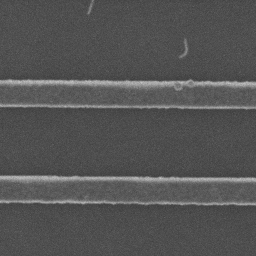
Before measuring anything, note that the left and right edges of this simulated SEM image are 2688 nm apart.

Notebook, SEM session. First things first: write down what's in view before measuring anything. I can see lines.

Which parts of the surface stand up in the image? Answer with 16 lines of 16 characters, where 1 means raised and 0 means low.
0000000000000000
0000000000000000
0000000000000000
0000000000000000
0000000000000000
1111111111111111
1111111111111111
0000000000000000
0000000000000000
0000000000000000
0000000000000000
1111111111111111
1111111111111111
0000000000000000
0000000000000000
0000000000000000